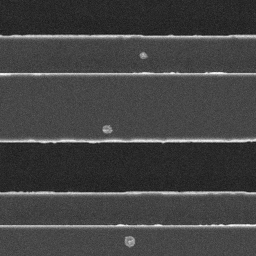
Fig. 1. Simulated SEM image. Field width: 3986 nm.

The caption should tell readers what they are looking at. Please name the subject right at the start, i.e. lines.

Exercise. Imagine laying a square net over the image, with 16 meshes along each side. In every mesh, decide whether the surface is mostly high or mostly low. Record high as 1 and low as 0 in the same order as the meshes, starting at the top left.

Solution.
0000000000000000
0000000000000000
1111111111111111
1111111111111111
1111111111111111
1111111111111111
1111111111111111
1111111111111111
1111111111111111
0000000000000000
0000000000000000
0000000000000000
1111111111111111
1111111111111111
1111111111111111
1111111111111111